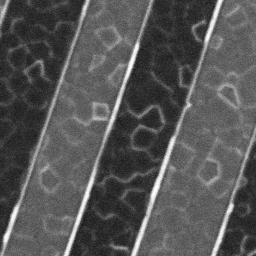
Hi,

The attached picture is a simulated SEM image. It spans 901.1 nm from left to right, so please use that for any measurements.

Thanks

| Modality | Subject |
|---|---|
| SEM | one or a few lines or trenches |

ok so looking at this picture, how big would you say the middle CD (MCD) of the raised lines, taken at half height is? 237 nanometres